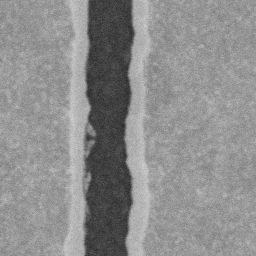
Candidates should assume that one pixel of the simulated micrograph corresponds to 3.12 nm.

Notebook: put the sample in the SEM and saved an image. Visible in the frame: one or a few lines or trenches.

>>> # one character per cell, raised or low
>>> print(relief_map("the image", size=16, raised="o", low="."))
ooooo....ooooooo
ooooo....ooooooo
ooooo....ooooooo
ooooo....ooooooo
ooooo....ooooooo
ooooo....ooooooo
ooooo....ooooooo
ooooo...oooooooo
ooooo....ooooooo
ooooo....ooooooo
ooooo....ooooooo
ooooo....ooooooo
ooooo....ooooooo
ooooo....ooooooo
ooooo....ooooooo
oooo.....ooooooo